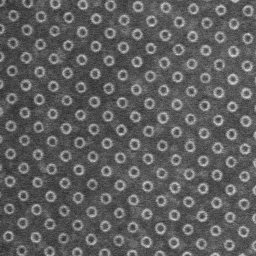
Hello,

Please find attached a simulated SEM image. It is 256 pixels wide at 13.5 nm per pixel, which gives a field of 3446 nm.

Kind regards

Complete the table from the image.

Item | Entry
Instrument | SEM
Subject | a regular array of raised bodies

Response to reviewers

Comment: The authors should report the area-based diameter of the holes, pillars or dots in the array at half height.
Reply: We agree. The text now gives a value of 119 nm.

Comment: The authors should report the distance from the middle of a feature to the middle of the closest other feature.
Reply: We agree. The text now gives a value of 19.2 px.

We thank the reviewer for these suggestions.